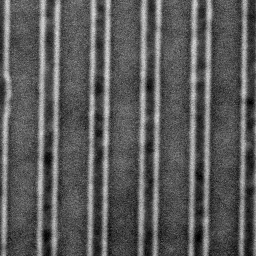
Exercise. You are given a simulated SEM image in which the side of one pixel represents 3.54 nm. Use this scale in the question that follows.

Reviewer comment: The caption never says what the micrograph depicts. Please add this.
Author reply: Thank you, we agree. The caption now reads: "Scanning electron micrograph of parallel lines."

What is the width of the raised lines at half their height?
52.7 nm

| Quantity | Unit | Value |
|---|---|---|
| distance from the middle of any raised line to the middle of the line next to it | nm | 179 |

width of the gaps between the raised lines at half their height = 35.5 px